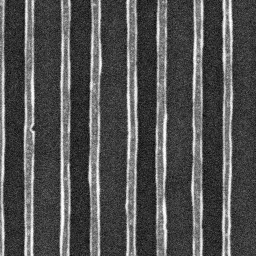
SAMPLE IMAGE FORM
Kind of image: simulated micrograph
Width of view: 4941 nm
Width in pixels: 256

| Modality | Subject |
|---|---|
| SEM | parallel lines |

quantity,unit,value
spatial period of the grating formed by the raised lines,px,33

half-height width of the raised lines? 154 nanometers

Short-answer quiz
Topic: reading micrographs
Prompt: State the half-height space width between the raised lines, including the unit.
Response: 432 nm